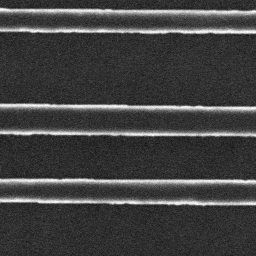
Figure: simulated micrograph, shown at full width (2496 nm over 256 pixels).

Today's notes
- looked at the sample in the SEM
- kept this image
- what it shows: lines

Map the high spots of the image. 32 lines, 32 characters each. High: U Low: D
DDDDDDDDDDDDDDDDDDDDDDDDDDDDDDDD
UUUUUUUUUUUUUUUUUUUUUUUUUUUUUUUU
UUUUUUUUUUUUUUUUUUUUUUUUUUUUUUUU
UUUUUUUUUUUUUUUUUUUUUUUUUUUUUUUU
DDDDDDDDDDDDDDDDDDDDDDDDDDDDDDDD
DDDDDDDDDDDDDDDDDDDDDDDDDDDDDDDD
DDDDDDDDDDDDDDDDDDDDDDDDDDDDDDDD
DDDDDDDDDDDDDDDDDDDDDDDDDDDDDDDD
DDDDDDDDDDDDDDDDDDDDDDDDDDDDDDDD
DDDDDDDDDDDDDDDDDDDDDDDDDDDDDDDD
DDDDDDDDDDDDDDDDDDDDDDDDDDDDDDDD
DDDDDDDDDDDDDDDDDDDDDDDDDDDDDDDD
DDDDDDDDDDDDDDDDDDDDDDDDDDDDDDDD
UUUUUUUUUUUUUUUUUUUUUUUUUUUUUUUD
UUUUUUUUUUUUUUUUUUUUUUUUUUUUUUUU
UUUUUUUUUUUUUUUUUUUUUUUUUUUUUUUU
UUUUUUUUUUUUUUUUUUUUUUUUUUUUUUUU
DDDDDDDDDDDDDDDDDDDDDDDDDDDDDDDD
DDDDDDDDDDDDDDDDDDDDDDDDDDDDDDDD
DDDDDDDDDDDDDDDDDDDDDDDDDDDDDDDD
DDDDDDDDDDDDDDDDDDDDDDDDDDDDDDDD
DDDDDDDDDDDDDDDDDDDDDDDDDDDDDDDD
DDUDDDDDUUUDDDDDDDDDDDDDDDDDDDDD
UUUUUUUUUUUUUUUUUUUUUUUUUUUUUUUU
UUUUUUUUUUUUUUUUUUUUUUUUUUUUUUUU
DDDDDDDDDDDDDDDDDDDDDDDDUUUUUUUU
DDDDDDDDDDDDDDDDDDDDDDDDDDDDDDDD
DDDDDDDDDDDDDDDDDDDDDDDDDDDDDDDD
DDDDDDDDDDDDDDDDDDDDDDDDDDDDDDDD
DDDDDDDDDDDDDDDDDDDDDDDDDDDDDDDD
DDDDDDDDDDDDDDDDDDDDDDDDDDDDDDDD
DDDDDDDDDDDDDDDDDDDDDDDDDDDDDDDD